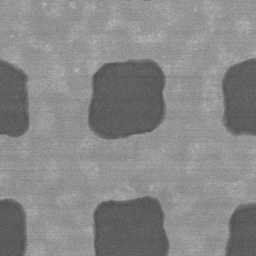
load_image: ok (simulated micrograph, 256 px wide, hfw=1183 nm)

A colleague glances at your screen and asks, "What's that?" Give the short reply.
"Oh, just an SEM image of holes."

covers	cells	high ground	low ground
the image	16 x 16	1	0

1111111111111111
1111111111111111
1111111111111111
1111111111111111
0111110000111100
0011110000111100
0011110000111100
0011110000111100
1111110011111111
1111111111111111
1111111111111111
1111111111111111
0111111100111111
0011110000111100
0011110000111100
0011110000011100